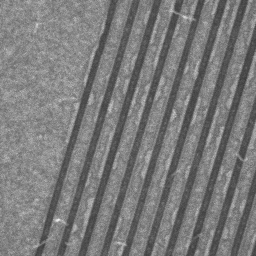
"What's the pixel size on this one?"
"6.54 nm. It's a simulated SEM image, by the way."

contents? parallel lines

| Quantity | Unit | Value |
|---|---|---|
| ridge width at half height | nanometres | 84.5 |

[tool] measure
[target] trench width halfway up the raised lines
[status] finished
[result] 54 nm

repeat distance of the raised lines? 136 nm